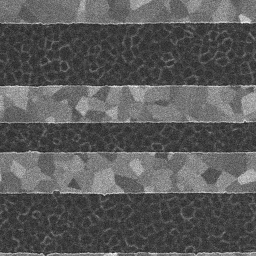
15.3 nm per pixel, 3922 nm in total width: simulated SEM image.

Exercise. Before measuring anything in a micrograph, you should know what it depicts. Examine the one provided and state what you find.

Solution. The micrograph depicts one or a few lines or trenches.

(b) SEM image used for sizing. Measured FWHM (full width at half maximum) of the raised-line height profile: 0.589 microns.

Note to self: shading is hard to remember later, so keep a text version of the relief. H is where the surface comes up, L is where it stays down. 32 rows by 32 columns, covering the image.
HHHHHHHHHHHHHHHHHHHHHHHHHHHHHHHH
HHHHHHHHHHHHHHHHHHHHHHHHHHHHHHHH
HHHHHHHHHHHHHHHHHHHHHHHHHHHHHHHH
LLLLLLLLLLLLLLLLLLLLLLLLLLLLLLLL
LLLLLLLLLLLLLLLLLLLLLLLLLLLLLLLL
LLLLLLLLLLLLLLLLLLLLLLLLLLLLLLLL
LLLLLLLLHLLLLLLLLLLLLLLLLLLLLLLL
LLLLLLLLLLLLLLLLLLLLLLLLLLLLLLLL
LLLLLLLLLLLLLLLLLLLLLLLLLLLLLLLL
LLLLLLLLLLLLLLLLLLLLLLLLLLLLLLLL
LLLLLLLLLLLLLLLLLLLLLLLLLLLLLLLL
HHHHHHHHHHHHHHHHHHHHHHHHHHHHHHHH
HHHHHHHHHHHHHHHHHHHHHHHHHHHHHHHH
HHHHHHHHHHHHHHHHHHHHHHHHHHHHHHHH
HHHHHHHHHHHHHHHHHHHHHHHHHHHHHHHH
LLLLLLLLLLLLLLLLLLLLLLLLLLLLLLLL
LLLLLLLLLLLLLLLLLLLLLLLLLLLLLHLL
LLLLLLLLLLLLLLLLLLLLLLLLLLLLLLLL
LLLLLLLLLLLLLLLLLLLLLLLLLLLLLLLL
HHHHHHHHHHHHHHHHHHHHHHHHHHHHHHHH
HHHHHHHHHHHHHHHHHHHHHHHHHHHHHHHH
HHHHHHHHHHHHHHHHHHHHHHHHHHHHHHHH
HHHHHHHHHHHHHHHHHHHHHHHHHHHHHHHH
HHHHHHHHHHHHHHHHHHHHHHHHHHHHHHHH
LLLLLLLLLLLLLLLLLLLLLLLLLLLLLLLL
LLLLLLLLLLLLLLLLLLLLLLLLLLLLLLLL
LLLLLLLLLLLLLLLLLLLLLLLLLLLLLLLL
LLLLLLLLLLLLLLLLLLLLLLLLLLLLLLLL
LLLLLLLLLLLLLLLLLLLLLLLLLLLLLLLL
LLLLLLLLLLLLLLLLLLLLLLLLLLLLLLLL
LLLLLLLLLLLLLLLLLLLLLLLLLLLLLLLL
LLLLLLHLLLLLLLLLLLLLLLLLLLLLLLLH